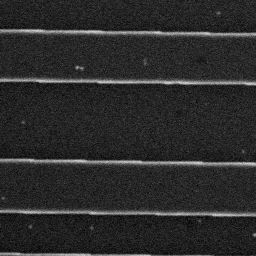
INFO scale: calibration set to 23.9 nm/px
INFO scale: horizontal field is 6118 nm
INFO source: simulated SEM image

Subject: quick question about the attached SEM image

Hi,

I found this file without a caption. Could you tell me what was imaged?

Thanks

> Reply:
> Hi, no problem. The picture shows lines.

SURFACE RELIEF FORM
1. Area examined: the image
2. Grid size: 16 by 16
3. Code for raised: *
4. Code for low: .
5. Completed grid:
................
................
****************
****************
****************
................
................
................
................
................
****************
****************
****************
................
................
................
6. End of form